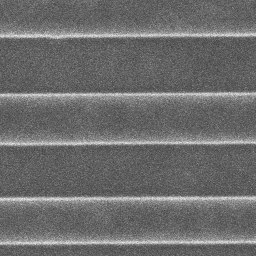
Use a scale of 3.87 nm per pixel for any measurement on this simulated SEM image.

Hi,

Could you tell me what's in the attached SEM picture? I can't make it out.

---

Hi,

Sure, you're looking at one or a few lines or trenches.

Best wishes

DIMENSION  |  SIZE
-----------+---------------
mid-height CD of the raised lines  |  184 nm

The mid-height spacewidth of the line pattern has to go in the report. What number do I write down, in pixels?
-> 55.9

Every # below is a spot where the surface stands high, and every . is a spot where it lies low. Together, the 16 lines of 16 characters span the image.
################
################
................
................
................
................
################
################
################
................
................
................
################
################
################
................